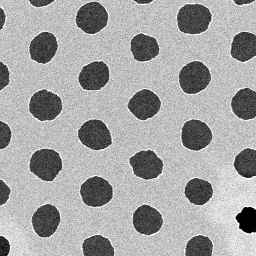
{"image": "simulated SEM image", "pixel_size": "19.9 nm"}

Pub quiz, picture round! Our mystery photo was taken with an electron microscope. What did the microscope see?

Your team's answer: a regular array of holes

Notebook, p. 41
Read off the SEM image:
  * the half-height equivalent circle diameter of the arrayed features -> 0.629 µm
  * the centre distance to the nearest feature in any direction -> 1.13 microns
